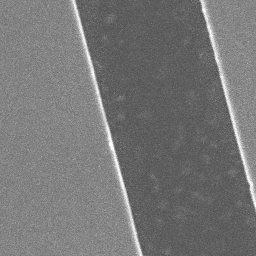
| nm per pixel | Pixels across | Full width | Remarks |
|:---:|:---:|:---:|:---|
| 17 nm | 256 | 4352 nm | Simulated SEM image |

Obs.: one or a few lines or trenches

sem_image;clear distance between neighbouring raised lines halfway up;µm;2.08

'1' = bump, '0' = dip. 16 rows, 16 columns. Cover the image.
1111100000000111
1111100000000111
1111100000000111
1111110000000111
1111110000000011
1111110000000011
1111110000000011
1111111000000001
1111111000000001
1111111000000001
1111111000000001
1111111100000000
1111111100000000
1111111100000000
1111111100000000
1111111110000000